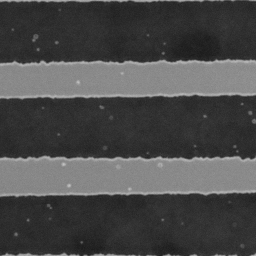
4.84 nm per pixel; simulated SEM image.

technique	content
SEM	lines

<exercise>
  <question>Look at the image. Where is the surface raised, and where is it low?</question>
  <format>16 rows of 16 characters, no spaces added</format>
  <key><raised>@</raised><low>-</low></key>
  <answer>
----------------
----------------
----------------
----------------
@@@@@@@@@@@@@@@@
@@@@@@@@@@@@@@@@
----------------
----------------
----------------
----------------
@@@@@@@@@@@@@@@@
@@@@@@@@@@@@@@@@
----------------
----------------
----------------
----------------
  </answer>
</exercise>